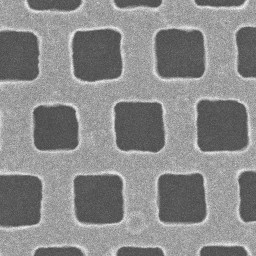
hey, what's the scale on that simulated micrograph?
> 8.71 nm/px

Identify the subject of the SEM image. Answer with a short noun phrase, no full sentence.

holes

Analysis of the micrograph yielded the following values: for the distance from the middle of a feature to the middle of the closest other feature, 0.72 µm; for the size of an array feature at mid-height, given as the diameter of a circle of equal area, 479 nm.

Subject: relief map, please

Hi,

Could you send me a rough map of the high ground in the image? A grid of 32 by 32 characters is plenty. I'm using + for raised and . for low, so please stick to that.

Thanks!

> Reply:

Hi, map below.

+++.......++++......+++++.....++
+++++++..+++++++++++++++++++++++
++++++++++++++++++++++++++++++++
++++++++++++++++++++++++++++++..
.....++++......++++......++++...
.....++++......++++.......++++..
.....++++......++++.......++++..
.....++++......++++.......++++..
.....++++......+++++......++++..
.....++++......+++++.....+++++..
++++++++++++++++++++++++++++++++
++++++++++++++++++++++++++++++++
+++++++++++++++++++++++++....+++
+++++....+++++......+++++......+
++++.....+++++......+++++......+
++++......++++.......+++.......+
++++......++++.......++++......+
++++......++++.......++++......+
+++++....++++++.....+++++......+
++++++++++++++++++++++++++++++++
++++++++++++++++++++++++++++++++
++++++++++++++++++++++++++++++..
.....++++......+++++.....+++++..
.....++++......+++++......++++..
.....++++......+++++......++++..
.....++++......+++++......++++..
.....++++......+++++......++++..
.....+++++.....+++++.....+++++..
++++++++++++++++++++++++++++++++
++++++++++++++++++++++++++++++++
++++++++++++++++++++++++++++++++
++++......+++++.....+++++......+